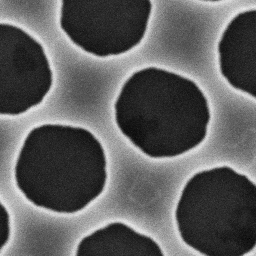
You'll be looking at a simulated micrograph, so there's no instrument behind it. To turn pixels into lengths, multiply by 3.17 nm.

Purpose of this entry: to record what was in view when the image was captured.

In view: holes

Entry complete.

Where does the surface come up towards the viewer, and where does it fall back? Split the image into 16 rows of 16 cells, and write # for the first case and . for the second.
####.....#######
####.....#####..
..##.....#####..
...###.#######..
...######..###..
...#####....###.
..#####......###
#######......###
##....##.....###
#......##...####
#......######.##
#......#####....
##....#####.....
.##########.....
.#####...##.....
#####.....##....